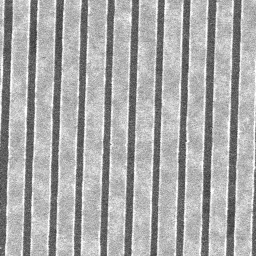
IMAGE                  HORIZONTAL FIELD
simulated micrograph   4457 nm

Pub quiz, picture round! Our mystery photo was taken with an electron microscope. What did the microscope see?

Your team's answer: parallel lines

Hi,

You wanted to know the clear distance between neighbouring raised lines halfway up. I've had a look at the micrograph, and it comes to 144 nanometres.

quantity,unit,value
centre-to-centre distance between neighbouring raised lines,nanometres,442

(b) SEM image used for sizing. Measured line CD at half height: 17.1 px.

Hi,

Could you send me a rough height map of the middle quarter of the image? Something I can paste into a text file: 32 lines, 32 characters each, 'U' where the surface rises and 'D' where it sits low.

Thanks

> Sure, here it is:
UUUUDDUUUUDDUUUUDDDUUUUDDUUUUDDU
UUUUDDUUUUDDUUUUDDDUUUUDDUUUUDDU
UUUUDDUUUUDDUUUUDDUUUUUDDUUUUDDU
UUUUDDUUUUDDUUUUDDUUUUUDDUUUUDDU
UUUUDDUUUUDDUUUUDDUUUUUDDUUUUDDU
UUUUDDUUUUDDUUUUDDUUUUUDDUUUUDDU
UUUUDDUUUUDDUUUUDDUUUUUDDUUUUDDU
UUUDDDUUUUDDUUUUDDUUUUUDDUUUUDDU
UUUDDDUUUUDDUUUUDDUUUUUDDUDUUDDU
UUUDDDUUUUDDUUUUDDUUUUDDDDDUUDDU
UUUDDUUUUUDDUUUUDDUUUUDDDUUUUDDU
UUUDDUUUUUDDUUUUDDUUUUDDDUUUUDDU
UUUDDUUUUUDDUUUUDDUUUUDDDUUUUDDU
UUUDDUUUUUDDUUUUDDUUUUDDDUUUUDDU
UUUDDUUUUUDDUUUUDDUUUUDDUUUUUDDU
UUUDDUUUUUDDUUUUDDUUUUDDUUUUUDDU
UUUDDUUUUUDDUUUUDDUUUUDDUUUUUDDU
UUUDDUUUUUDDUUUUDDUUUUDDUUUUUDDU
UUUDDUUUUUDDUUUUDDUUUUDDUUUUUDDU
UDUDDUUUUDDDUUUUDDUUUUDDUUUUUDDU
UUUDDUUUUUDDUUUUDDUUUUDDUUUUUDDU
UUUDDUUUUUDDUUUUDDUUUUDDUUUUDDDU
UUUDDUUUUUDDUUUUDDUUUUDDUUUUDDDU
UUUDDUUUUDDDUUUUDDUUUUDDUUUUDDDU
UUUDDUUUUDDDUUUUDDUUUUDDUUUUDDDU
UUUDDUUUUDDDUUUDDDUUUUDDUUUUDDDU
UUUDDUUUUDDDUUUDDDUUUUDDUUUUDDDU
UUUDDUUUUDDDUUUDDDUUUUDDUUUUDDDU
UUUDDUUUUDDUUUUDDDUUUUDDUUUUDDDU
UUUDDUUUUDDUUUUDDDUUUUDDUUUUDDDU
UUUDDUUUUDDUUUUDDDUUUUDDUUUUDDDU
UUUDDUUUUDDUUUUDDDUUUUDDUUUUDDUU